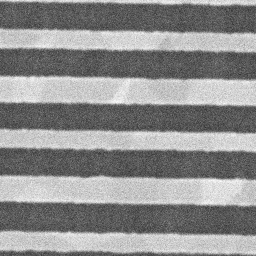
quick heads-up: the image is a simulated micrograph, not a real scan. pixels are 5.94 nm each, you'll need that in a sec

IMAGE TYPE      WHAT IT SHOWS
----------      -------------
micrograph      lines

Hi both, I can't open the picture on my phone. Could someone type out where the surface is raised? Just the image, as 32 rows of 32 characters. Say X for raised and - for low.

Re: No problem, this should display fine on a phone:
--------------------------XXX-XX
--------------------------------
--------------------------------
--------------------------------
XXXXXXXXXXXXXXXXXXXXXXXXXXXXXXXX
XXXXXXXXXXXXXXXXXXXXXXXXXXXXXXXX
--------------------------------
--------------------------------
--------------------------------
--------------------------------
XXXXXXXXXXXXXXXXXXXXXXXXXXXXXXXX
XXXXXXXXXXXXXXXXXXXXXXXXXXXXXXXX
XXXXXXXXXXXXXXXXXXXXXXXXXXXXXXXX
--------------------------------
--------------------------------
--------------------------------
XXXXXXXXXXXXXX------------------
XXXXXXXXXXXXXXXXXXXXXXXXXXXXXXXX
---XXXXXXXXXXXXXXXXXXXXXXXXXXXXX
--------------------------------
--------------------------------
--------------------------------
XXXXXXXXXXXXXXXXXXXXXXXXXXXX-X--
XXXXXXXXXXXXXXXXXXXXXXXXXXXXXXXX
XXXXXXXXXXXXXXXXXXXXXXXXXXXXXXXX
------------------------XXXXXXXX
--------------------------------
--------------------------------
--------------------------------
XXXXXXXXXXXXXXXXXXXXXXXXXXXXXXX-
XXXXXXXXXXXXXXXXXXXXXXXXXXXXXXXX
--------------XXX--XXXXXXXXXXXXX